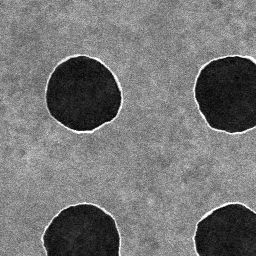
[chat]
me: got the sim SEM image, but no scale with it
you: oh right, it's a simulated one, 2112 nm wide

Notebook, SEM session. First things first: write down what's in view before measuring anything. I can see holes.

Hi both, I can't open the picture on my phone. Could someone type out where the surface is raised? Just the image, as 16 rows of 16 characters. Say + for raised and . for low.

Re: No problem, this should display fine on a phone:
++++++++++++++++
++++++++++++++++
++++++++++++++++
++++++++++++++++
+++....++++++...
+++....+++++....
+++.....++++....
++++...++++++...
++++++++++++++++
++++++++++++++++
++++++++++++++++
++++++++++++++++
++++++++++++++++
++++...++++++...
+++....+++++....
+++....+++++....